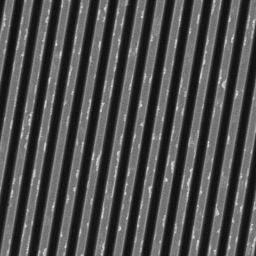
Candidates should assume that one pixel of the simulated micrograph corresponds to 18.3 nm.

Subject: parallel lines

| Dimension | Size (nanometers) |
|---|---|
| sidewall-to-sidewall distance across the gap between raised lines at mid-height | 158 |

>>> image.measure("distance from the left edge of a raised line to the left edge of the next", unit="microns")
0.34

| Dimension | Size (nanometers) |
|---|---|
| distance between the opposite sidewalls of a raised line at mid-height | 174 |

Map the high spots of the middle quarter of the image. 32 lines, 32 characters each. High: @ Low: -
-@@@--@@---@@---@@--@@@--@@---@@
-@@---@@---@@--@@@--@@---@@---@@
-@@---@@--@@@--@@---@@---@@--@@@
-@@---@@--@@@--@@---@@--@@@--@@-
-@@--@@@--@@@--@@---@@--@@@--@@-
-@@--@@@--@@---@@--@@@--@@@--@@-
@@@--@@---@@---@@--@@@--@@---@@-
@@---@@---@@--@@@--@@---@@--@@@-
@@---@@--@@@--@@---@@---@@--@@@-
@@---@@--@@@--@@---@@--@@@--@@--
@@--@@@--@@@--@@---@@--@@@--@@--
@@--@@@--@@---@@--@@@--@@@--@@--
@@--@@---@@--@@@--@@@--@@---@@--
@---@@---@@--@@@--@@---@@--@@@--
@---@@--@@@--@@---@@---@@--@@@--
@---@@--@@@--@@---@@--@@@--@@---
@--@@@--@@@--@@---@@--@@@--@@---
@--@@@--@@---@@--@@@--@@---@@--@
@--@@---@@--@@@--@@@--@@---@@--@
---@@---@@--@@@--@@---@@--@@@--@
---@@--@@@--@@---@@--@@@--@@@--@
---@@--@@@--@@---@@--@@@--@@---@
--@@@--@@---@@---@@--@@@--@@---@
--@@@--@@---@@--@@@--@@---@@--@@
--@@---@@--@@@--@@@--@@---@@--@@
--@@--@@@--@@@--@@---@@--@@@--@@
--@@--@@@--@@---@@--@@@--@@@--@@
--@@--@@---@@---@@--@@@--@@---@@
-@@@--@@---@@---@@--@@@--@@---@@
-@@@--@@---@@--@@@--@@---@@--@@@
-@@---@@--@@@--@@---@@---@@--@@@
-@@--@@@--@@@--@@---@@--@@@--@@-